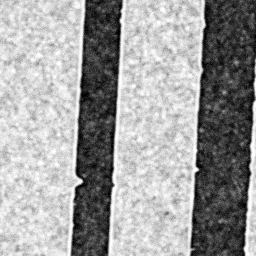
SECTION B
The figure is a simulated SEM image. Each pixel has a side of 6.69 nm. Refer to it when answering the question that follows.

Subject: one or a few lines or trenches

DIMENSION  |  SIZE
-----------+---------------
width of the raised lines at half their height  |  531 nm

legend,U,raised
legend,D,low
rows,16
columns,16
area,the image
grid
UUUUUDDDUUUUUDDD
UUUUUDDDUUUUUDDD
UUUUUDDDUUUUUDDD
UUUUUDDDUUUUUDDD
UUUUUDDDUUUUUDDD
UUUUUDDUUUUUDDDD
UUUUUDDUUUUUDDDD
UUUUUDDUUUUUDDDD
UUUUUDDUUUUUDDDD
UUUUUDDUUUUUDDDD
UUUUUDDUUUUUDDDD
UUUUUDDUUUUUDDDD
UUUUUDDUUUUUDDDD
UUUUDDDUUUUUDDDD
UUUUDDDUUUUUDDDU
UUUUDDDUUUUUDDDU